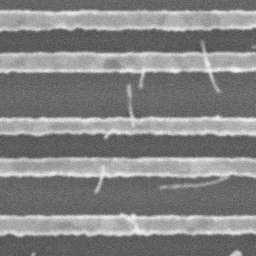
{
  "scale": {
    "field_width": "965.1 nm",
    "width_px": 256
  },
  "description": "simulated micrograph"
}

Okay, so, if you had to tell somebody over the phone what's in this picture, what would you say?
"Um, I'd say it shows lines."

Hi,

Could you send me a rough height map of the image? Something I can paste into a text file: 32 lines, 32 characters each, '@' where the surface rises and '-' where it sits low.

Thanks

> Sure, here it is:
--------------------------------
@@@@@@@@@@@@@@@@@@@@@@@@@@@@@@@@
@@@@@@@@@@@@@@@@@@@@@@@@@@@@@@@@
@@@@@@@-@-@@@@@@@@@@@@@@@@@@@@@-
--------------------------------
--------------------------------
--------------------------------
@@@@@@@@@@@@@@@@@@@@@@@@@@@@@@@@
@@@@@@@@@@@@@@@@@@@@@@@@@@@@@@@@
--------------------------------
--------------------------------
--------------------------------
--------------------------------
--------------------------------
--------------------------------
@@@@@@@@@@@@@@@@@@@@@@@@@@@@@@@@
@@@@@@@@@@@@@@@@@@@@@@@@@@@@@@@@
--------------------------------
--------------------------------
--------------------------------
@@@@@@@@@@@@@@@@@@@@@@@@@@@@@@@@
@@@@@@@@@@@@@@@@@@@@@@@@@@@@@@@@
--------------------------------
--------------------------------
--------------------------------
--------------------------------
--------------------------------
@@@@@@@@@@@@@@@@@@@@@@@@@@@@@@@@
@@@@@@@@@@@@@@@@@@@@@@@@@@@@@@@@
--@-----------------------------
--------------------------------
--------------------------------